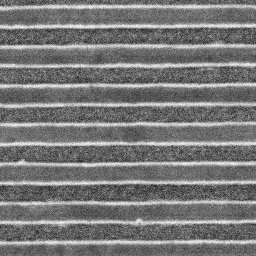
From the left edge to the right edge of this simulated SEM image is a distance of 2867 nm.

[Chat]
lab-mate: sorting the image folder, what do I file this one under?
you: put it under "parallel lines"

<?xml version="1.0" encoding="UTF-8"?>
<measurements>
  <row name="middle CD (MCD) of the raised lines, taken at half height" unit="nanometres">227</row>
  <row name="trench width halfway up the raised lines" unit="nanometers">209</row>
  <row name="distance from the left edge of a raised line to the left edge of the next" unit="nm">439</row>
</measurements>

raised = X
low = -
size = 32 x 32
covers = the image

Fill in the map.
--------------------------------
XXXXXXXXXXXXXXXXXXXXXXXXXXXXXXXX
XXXXXXXXXXXXXXXXXXXXXXXXXXXXXXXX
--------------------------------
--------------------------------
--------------------------------
XXXXXXXXXXXXXXXXXXXXXXXXXXXXXXXX
XXXXXXXXXXXXXXXXXXXXXXXXXXXXXXXX
--------------------------------
--------------------------------
--------------------------------
XXXXXXXXXXXXXXXXXXXXXXXXXXXXXXXX
XXXXXXXXXXXXXXXXXXXXXXXXXXXXXXXX
--------------------------------
--------------------------------
-----------------XX----X--XXXXXX
XXXXXXXXXXXXXXXXXXXXXXXXXXXXXXXX
XXXXXXXXXXXXXXXXXXXXXXXXXXXXXXXX
--------------------------------
--------------------------------
XXXX--------XXXXXXXXXXXXXXXXXXXX
XXXXXXXXXXXXXXXXXXXXXXXXXXXXXXXX
XXXXXXXXXXXXXXXXXXXXXXXXXXXXXXXX
--------------------------------
--------------------------------
XXXXXXXXXXXXXXXXXXXXXXXXXXXXXXXX
XXXXXXXXXXXXXXXXXXXXXXXXXXXXXXXX
XXXXXXXXXXXXXXXXXXXXXXXXXXXXXXXX
--------------------------------
--------------------------------
XXXXXXXXXXXXXXXXXXXXXXXXXXXXXXXX
XXXXXXXXXXXXXXXXXXXXXXXXXXXXXXXX